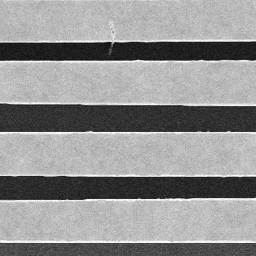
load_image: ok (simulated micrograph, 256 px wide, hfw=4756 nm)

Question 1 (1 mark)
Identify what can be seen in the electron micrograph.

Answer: lines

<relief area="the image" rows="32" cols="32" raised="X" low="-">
XXXXXXXXXXXXXXXXXXXXXXXXXXXXXXXX
XXXXXXXXXXXXXXXXXXXXXXXXXXXXXXXX
XXXXXXXXXXXXXXXXXXXXXXXXXXXXXXXX
XXXXXXXXXXXXXXXXXXXXXXXXXXXXXXXX
XXXXXXXXXXXXXXXXXXXXXXXXXXXXXXXX
--------------------------------
--------------------------------
--------------------------------
XXXXXXXXXXXXXXXXXXXXXXXXXXXXXXXX
XXXXXXXXXXXXXXXXXXXXXXXXXXXXXXXX
XXXXXXXXXXXXXXXXXXXXXXXXXXXXXXXX
XXXXXXXXXXXXXXXXXXXXXXXXXXXXXXXX
XXXXXXXXXXXXXXXXXXXXXXXXXXXXXXXX
--------------------------------
--------------------------------
--------------------------------
-----------X----------------X---
XXXXXXXXXXXXXXXXXXXXXXXXXXXXXXXX
XXXXXXXXXXXXXXXXXXXXXXXXXXXXXXXX
XXXXXXXXXXXXXXXXXXXXXXXXXXXXXXXX
XXXXXXXXXXXXXXXXXXXXXXXXXXXXXXXX
XXXXXXXXXXXXXXXXXXXXXXXXXXXXXXXX
--------------------------------
--------------------------------
--------------------------------
XXXXXXXXXXXXXXXXXXXXXXXXXXXXXXXX
XXXXXXXXXXXXXXXXXXXXXXXXXXXXXXXX
XXXXXXXXXXXXXXXXXXXXXXXXXXXXXXXX
XXXXXXXXXXXXXXXXXXXXXXXXXXXXXXXX
XXXXXXXXXXXXXXXXXXXXXXXXXXXXXXXX
--------------------------------
--------------------------------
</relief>